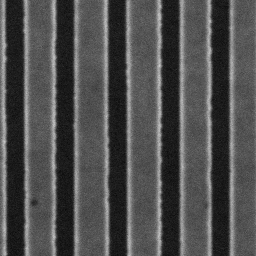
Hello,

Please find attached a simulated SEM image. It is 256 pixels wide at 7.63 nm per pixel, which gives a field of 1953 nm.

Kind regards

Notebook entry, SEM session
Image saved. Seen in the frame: lines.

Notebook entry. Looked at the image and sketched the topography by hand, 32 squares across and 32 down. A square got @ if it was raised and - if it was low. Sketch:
@--@@@@--@@@@---@@@@---@@@---@@@
@--@@@@--@@@@---@@@@---@@@---@@@
@--@@@@--@@@@---@@@@---@@@---@@@
@--@@@@--@@@@---@@@@---@@@---@@@
@--@@@@--@@@@---@@@@---@@@---@@@
@--@@@@--@@@@---@@@@---@@@---@@@
@--@@@@--@@@@---@@@@---@@@---@@@
@--@@@@--@@@@---@@@@---@@@---@@@
@--@@@@--@@@@---@@@@---@@@---@@@
@--@@@@--@@@@---@@@@---@@@---@@@
@--@@@@--@@@@---@@@@---@@@---@@@
@--@@@@--@@@@---@@@@---@@@---@@@
@--@@@@--@@@@---@@@@---@@@---@@@
@--@@@@--@@@@---@@@@---@@@---@@@
@--@@@@--@@@@---@@@@---@@@---@@@
@--@@@@--@@@@---@@@@---@@@---@@@
@--@@@@--@@@@---@@@@---@@@---@@@
@--@@@@--@@@@---@@@@---@@@---@@@
@--@@@@--@@@@---@@@@---@@@---@@@
@--@@@@--@@@@---@@@@---@@@---@@@
@--@@@@--@@@@---@@@@---@@@---@@@
@--@@@@--@@@@---@@@@---@@@---@@@
@--@@@@--@@@@---@@@@---@@@---@@@
@--@@@@--@@@@---@@@@---@@@---@@@
@--@@@@--@@@@---@@@@---@@@---@@@
@--@@@@--@@@@---@@@@---@@@---@@@
@--@@@@--@@@@---@@@@---@@@---@@@
@--@@@@--@@@@---@@@@---@@@---@@@
@--@@@@--@@@@---@@@@---@@@---@@@
@--@@@@--@@@@---@@@@---@@@---@@@
@--@@@@--@@@@@--@@@@---@@@---@@@
@--@@@@--@@@@---@@@@---@@@---@@@